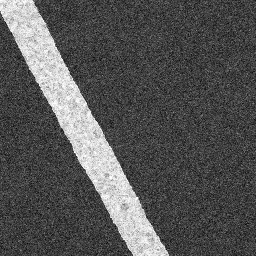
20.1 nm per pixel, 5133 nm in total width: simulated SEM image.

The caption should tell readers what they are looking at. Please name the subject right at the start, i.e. one or a few lines or trenches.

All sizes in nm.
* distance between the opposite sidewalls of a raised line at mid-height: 640